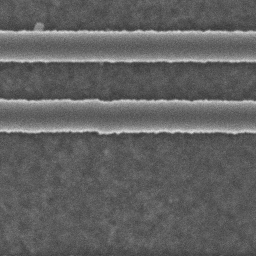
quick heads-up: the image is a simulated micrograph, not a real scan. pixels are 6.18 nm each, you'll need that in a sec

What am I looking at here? lines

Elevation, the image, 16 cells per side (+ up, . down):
................
................
++++++++++++++++
++++++++++++++++
................
................
++++++++++++++++
++++++++++++++++
................
................
................
................
................
................
................
................